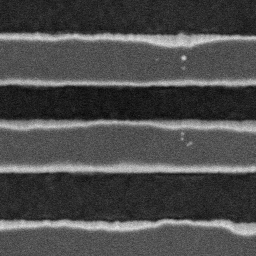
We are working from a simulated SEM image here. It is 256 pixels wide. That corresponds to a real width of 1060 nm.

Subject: lines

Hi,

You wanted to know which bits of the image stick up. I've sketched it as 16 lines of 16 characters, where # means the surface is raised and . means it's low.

................
................
################
################
################
................
................
................
################
################
################
................
................
................
################
################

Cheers